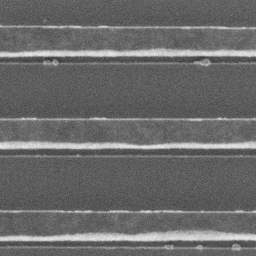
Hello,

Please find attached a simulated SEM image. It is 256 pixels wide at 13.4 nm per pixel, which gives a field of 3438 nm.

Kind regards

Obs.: lines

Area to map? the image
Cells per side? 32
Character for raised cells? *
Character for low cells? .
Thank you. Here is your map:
................................
................................
................................
*****************************...
********************************
********************************
********************************
................................
................................
................................
................................
................................
................................
................................
................................
********************************
********************************
********************************
................................
................................
................................
................................
................................
................................
................................
................................
************.***.******..*...***
********************************
********************************
********************************
................................
................................